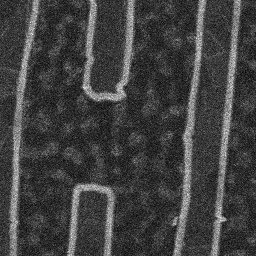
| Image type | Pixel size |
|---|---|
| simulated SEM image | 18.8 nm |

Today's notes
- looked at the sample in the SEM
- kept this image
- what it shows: one or a few lines or trenches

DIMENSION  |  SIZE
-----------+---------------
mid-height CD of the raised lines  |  670 nm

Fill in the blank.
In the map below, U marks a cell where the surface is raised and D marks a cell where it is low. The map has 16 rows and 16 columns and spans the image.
UUDDDDUUDDDDDUUD
UUDDDDUUDDDDUUUD
UUDDDDUUDDDDUUUD
UUDDDDUUDDDDUUUD
UUDDDUUUDDDDUUDD
UDDDDUUUDDDDUUDD
UDDDDDDDDDDDUUDD
UDDDDDDDDDDDUUDD
UDDDDDDDDDDDUUDD
UDDDDDDDDDDDUUDD
UDDDDDDDDDDDUUDD
UDDDDDDDDDDDUUDD
UDDDDUUDDDDDUUDD
UDDDDUUDDDDUUUDD
UDDDDUUDDDDUUUDD
UDDDUUUDDDDUUDDD